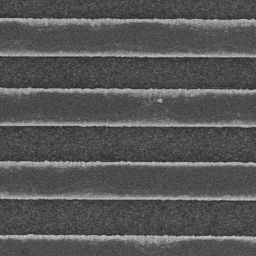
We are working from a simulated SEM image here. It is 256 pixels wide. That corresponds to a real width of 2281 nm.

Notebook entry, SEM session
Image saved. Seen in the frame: lines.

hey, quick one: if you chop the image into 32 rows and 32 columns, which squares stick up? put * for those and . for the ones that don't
................................
................................
*****..****..*******..*.........
********************************
********************************
********************************
********************************
................................
................................
................................
................................
********************************
********************************
********************************
********************************
********************************
................................
................................
................................
................................
********************************
********************************
********************************
********************************
********************************
................................
................................
................................
................................
.*****..........................
********************************
********************************